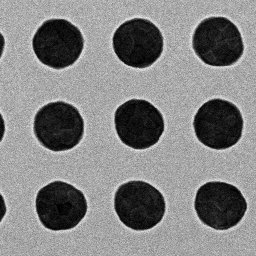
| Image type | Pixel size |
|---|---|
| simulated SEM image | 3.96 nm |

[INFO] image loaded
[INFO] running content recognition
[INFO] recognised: a regular array of holes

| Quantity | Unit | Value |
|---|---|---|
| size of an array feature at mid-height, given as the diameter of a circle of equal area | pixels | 49.5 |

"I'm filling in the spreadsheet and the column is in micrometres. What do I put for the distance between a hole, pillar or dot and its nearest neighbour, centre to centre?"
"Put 0.316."